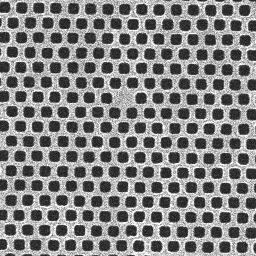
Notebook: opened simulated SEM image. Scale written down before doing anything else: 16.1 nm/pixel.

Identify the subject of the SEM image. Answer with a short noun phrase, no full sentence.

a regular array of holes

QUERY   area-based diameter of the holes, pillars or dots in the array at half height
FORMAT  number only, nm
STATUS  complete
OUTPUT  195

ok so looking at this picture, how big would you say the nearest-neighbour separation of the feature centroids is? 268 nm